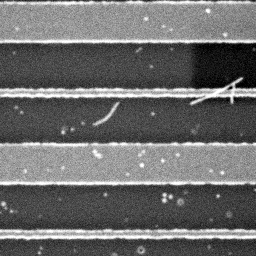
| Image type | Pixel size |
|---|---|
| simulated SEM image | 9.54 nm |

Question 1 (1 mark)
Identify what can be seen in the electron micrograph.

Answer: lines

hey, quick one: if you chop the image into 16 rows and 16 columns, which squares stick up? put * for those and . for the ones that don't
****************
****************
****************
................
................
................
................
................
................
****************
****************
................
................
................
................
................